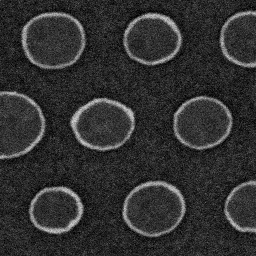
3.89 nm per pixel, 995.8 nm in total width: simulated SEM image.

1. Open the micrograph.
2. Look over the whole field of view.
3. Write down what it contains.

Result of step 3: raised bodies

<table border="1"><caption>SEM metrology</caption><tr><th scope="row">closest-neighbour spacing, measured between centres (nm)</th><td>379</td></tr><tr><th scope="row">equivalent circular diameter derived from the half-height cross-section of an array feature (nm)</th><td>217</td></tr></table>